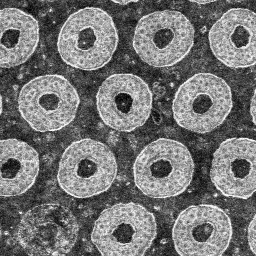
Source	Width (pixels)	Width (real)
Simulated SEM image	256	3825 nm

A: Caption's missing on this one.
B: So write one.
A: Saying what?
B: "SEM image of ring-shaped raised bodies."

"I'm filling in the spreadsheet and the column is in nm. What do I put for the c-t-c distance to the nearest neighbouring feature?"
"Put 1120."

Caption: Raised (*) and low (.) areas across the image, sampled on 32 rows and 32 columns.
................................
***.......***......***......***.
****....******....*****....*****
*.***...******...*******...**..*
...**..***..***..**...**..***..*
..**...***..***..**..***..***..*
****....******...******....*****
***.....******....****......****
..........**....................
.....**.......***.......***.....
...******....*****.....*****....
...******...*******...*******...
..***..***..**...**...**...**..*
..***..**...***.***...**..***..*
...******....*******..******....
....****.....*****.....****.....
.........................*......
..........*.........*........**.
****.....****.....*****....*****
*****...******...*******...*****
...**...**..**...**..***...**..*
..***..**...**...**...**..***..*
****...*******...*******...*****
***.....*****....******....*****
.........**........**.........*.
................................
.............******....*****....
............*******...*******...
............**...**...**...**..*
............**...**...**..***..*
............***.***...******...*
.............*****....******....